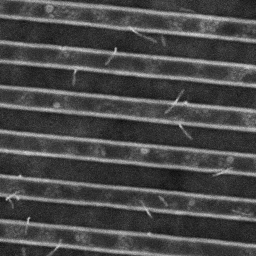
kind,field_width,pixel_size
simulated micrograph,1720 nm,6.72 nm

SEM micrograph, parallel lines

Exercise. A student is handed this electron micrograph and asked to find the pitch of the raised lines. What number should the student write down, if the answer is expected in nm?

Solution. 299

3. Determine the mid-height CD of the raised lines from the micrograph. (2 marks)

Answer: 134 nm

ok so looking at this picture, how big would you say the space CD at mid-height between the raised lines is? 170 nm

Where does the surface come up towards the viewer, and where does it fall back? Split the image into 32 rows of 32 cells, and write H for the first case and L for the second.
HHHHHHHHHLLLLLLLLLLLLLLLLLLLLLLL
HHHHHHHHHHHHHHHHHHHLLLLLLLLLLLLL
LLLLLHHHHHHHHHHHHHHHHHHHHHHHHLLL
LLLLLLLLLLLLLLHHHHHHHHHHHHHHHHHH
LLLLLLLLLLLLLLLLLLLLLLLLLLHHHHHH
HHHLLLLLLLLLLLLLLLLLLLLLLLLLLLLL
HHHHHHHHHHHHHLLLLLLLLLLLLLLLLLLL
HHHHHHHHHHHHHHHHHHHHHHHLLLLLLLLL
LLLLLLLLLHHHHHHHHHHHHHHHHHHHHHHH
LLLLLLLLLLLLLLLLLLLHHHHHHHHHHHHH
LLLLLLLLLLLLLLLLLLLLLLLLLLLLLHHH
HHHHHHHLLLLLLLLLLLLLLLLLLLLLLLLL
HHHHHHHHHHHHHHHHHHLLLLLLLLLLLLLL
LLLHHHHHHHHHHHHHHHHHHHHHHHHHLLLL
LLLLLLLLLLLLLLHHHHHHHHHHHHHHHHHH
LLLLLLLLLLLLLLLLLLLLLLLHHHHHHHHH
HLLLLLLLLLLLLLLLLLLLLLLLLLLLLLLL
HHHHHHHHHHHHLLLLLLLLLLLLLLLLLLLL
HHHHHHHHHHHHHHHHHHHHHHLLLLLLLLLL
LLLLLLLHHHHHHHHHHHHHHHHHHHHHHHHH
LLLLLLLLLLLLLLLLLHHHHHHHHHHHHHHH
LLLLLLLLLLLLLLLLLLLLLLLLLLLHHHHH
HHHHHLLLLLLLLLLLLLLLLLLLLLLLLLLL
HHHHHHHHHHHHHHHHLLLLLLLLLLLLLLLL
HHHHHHHHHHHHHHHHHHHHHHHHHLLLLLLL
LLLLLLLLLLLHHHHHHHHHHHHHHHHHHHHH
LLLLLLLLLLLLLLLLLLLLLHHHHHHHHHHH
LLLLLLLLLLLLLLLLLLLLLLLLLLLLLLLL
HHHHHHHHHLLLLLLLLLLLLLLLLLLLLLLL
HHHHHHHHHHHHHHHHHHHLLLLLLLLLLLLL
LLLLHHHHHHHHHHHHHHHHHHHHHHHHHHLL
LLLLLLLLLLLLLLLHHHHHHHHHHHHHHHHH